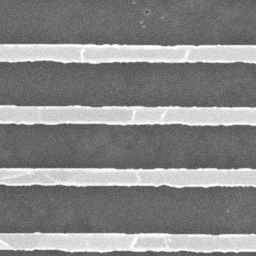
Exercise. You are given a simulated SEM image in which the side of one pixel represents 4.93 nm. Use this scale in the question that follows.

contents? lines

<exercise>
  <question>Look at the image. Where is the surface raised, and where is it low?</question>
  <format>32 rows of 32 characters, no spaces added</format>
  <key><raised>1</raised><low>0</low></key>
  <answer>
00000000000000000000000000000000
00000000000000000000000000000000
00000000000000000000000000000000
00000000000000000000000000000000
00000000000000000000000000000000
00000000000000000000000000000000
11111111111111111111111111111111
11110011111111111111111111111111
00000000000000000000000000000000
00000000000000000000000000000000
00000000000000000000000000000000
00000000000000000000000000000000
00000000000000000000000000000000
11111111111111111100111010000000
11111111111111111111111111111111
00000000000000010000000111111001
00000000000000000000000000000000
00000000000000000000000000000000
00000000000000000000000000000000
00000000000000000000000000000000
00000000000000000000000000000000
11111111111111111111111111111111
11111111111111111111111111111111
00000000000000000000000000000000
00000000000000000000000000000000
00000000000000000000000000000000
00000000000000000000000000000000
00000000000000000000000000000000
00000000000000000000000000000000
11111111111111111111111111111111
11111111111111111111111111111111
00000000000000000000000000000000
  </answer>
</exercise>